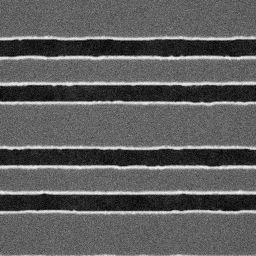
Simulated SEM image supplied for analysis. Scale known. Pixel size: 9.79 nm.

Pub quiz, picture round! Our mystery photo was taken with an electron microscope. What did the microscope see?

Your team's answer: lines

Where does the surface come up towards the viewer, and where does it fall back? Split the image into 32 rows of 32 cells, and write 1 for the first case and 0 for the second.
11111111111111111111111111111111
11111111111111111111111111111111
11111111111111111111111111111111
11111111111111111111111111111111
11111111111111111111111111111111
00000000000000000000000000000000
00000000000000000000000000000000
11111111111111111111111111111111
11111111111111111111111111111111
11111111111111111111111111111111
11111111111111111111111111111110
00000000000000000000000000000000
00000000000000000000000000000000
11111111111111111111111111111111
11111111111111111111111111111111
11111111111111111111111111111111
11111111111111111111111111111111
11111111111111111111111111111111
11111111111111111111111111111111
00000000000000000000000000000000
00000000000000000000000000000000
11111111111111111111111111111111
11111111111111111111111111111111
11111111111111111111111111111111
00000000000000000000000000000000
00000000000000000000000000000000
11111111111111111111111111111111
11111111111111111111111111111111
11111111111111111111111111111111
11111111111111111111111111111111
11111111111111111111111111111111
11111111111111111111111111111111